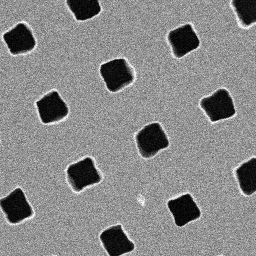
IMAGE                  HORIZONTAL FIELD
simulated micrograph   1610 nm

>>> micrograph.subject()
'a regular array of holes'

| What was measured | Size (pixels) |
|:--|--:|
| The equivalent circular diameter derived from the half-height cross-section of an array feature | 28.9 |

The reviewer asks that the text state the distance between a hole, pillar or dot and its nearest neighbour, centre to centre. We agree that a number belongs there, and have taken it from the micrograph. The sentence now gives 468 nanometers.